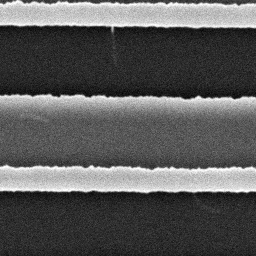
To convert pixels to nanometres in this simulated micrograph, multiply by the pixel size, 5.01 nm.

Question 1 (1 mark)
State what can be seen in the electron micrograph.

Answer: lines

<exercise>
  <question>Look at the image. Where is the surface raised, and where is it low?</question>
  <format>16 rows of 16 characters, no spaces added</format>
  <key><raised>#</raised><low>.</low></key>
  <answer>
################
################
................
................
................
................
################
################
################
################
################
################
................
................
................
................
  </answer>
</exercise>